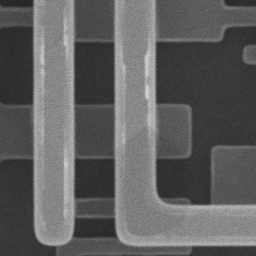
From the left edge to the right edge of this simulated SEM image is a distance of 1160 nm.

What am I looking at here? wiring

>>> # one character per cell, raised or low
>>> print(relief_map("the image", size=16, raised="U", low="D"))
DDUUUDDUUUDDDDDD
DDUUUDDUUUDDDDDD
DDUUUDDUUUDDDDDD
DDUUUDDUUUDDDDDD
DDUUUDDUUUDDDDDD
DDUUUDDUUUDDDDDD
DDUUUDDUUUDDDDDD
DDUUUDDUUUDDDDDD
DDUUUDDUUUDDDDDD
DDUUUDDUUUDDDDDD
DDUUUDDUUUDDDDDD
DDUUUDDUUUDDDDDD
DDUUUDDUUUDDDDDD
DDUUUDDUUUUUUUUU
DDUUUDDUUUUUUUUU
DDDDDDDDDDDDDDDD